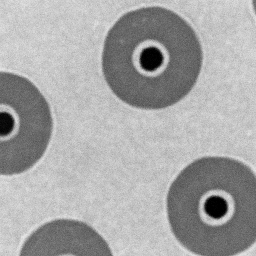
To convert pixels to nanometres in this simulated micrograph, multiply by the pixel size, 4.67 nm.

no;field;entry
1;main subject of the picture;ring-shaped grooves with a dot in the middle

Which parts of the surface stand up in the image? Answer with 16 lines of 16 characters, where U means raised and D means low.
UUUUUUUUUDUUUUUU
UUUUUUUDDDDDUUUU
UUUUUUUDDDDDUUUU
UUUUUUDDDDDDDUUU
UUUUUUDDDDDDUUUU
DDUUUUUDDDDDUUUU
DDDUUUUUDDDUUUUU
DDDUUUUUUUUUUUUU
DDDUUUUUUUUUUUUU
DDDUUUUUUUUUUUUU
DDUUUUUUUUUUDDDD
UUUUUUUUUUUDDDDD
UUUUUUUUUUDDDDDD
UUUUUUUUUUDDDDDD
UUDDDDUUUUUDDDDD
UDDDDDDUUUUUDDDU